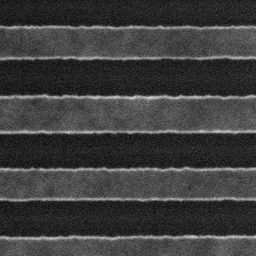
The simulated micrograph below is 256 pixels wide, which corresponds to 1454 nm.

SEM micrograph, lines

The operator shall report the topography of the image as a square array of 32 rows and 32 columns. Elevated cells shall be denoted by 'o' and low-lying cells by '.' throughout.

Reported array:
................................
................................
................................
oooooooooooooooooooooooooooooooo
oooooooooooooooooooooooooooooooo
oooooooooooooooooooooooooooooooo
oooooooooooooooooooooooooooooooo
................................
................................
................................
................................
................................
oooooooooooooooooooooooooooooooo
oooooooooooooooooooooooooooooooo
oooooooooooooooooooooooooooooooo
oooooooooooooooooooooooooooooooo
oooooooooooooooooooooooooooooooo
................................
................................
................................
................................
oooooooooooooooooooooooooooooooo
oooooooooooooooooooooooooooooooo
oooooooooooooooooooooooooooooooo
oooooooooooooooooooooooooooooooo
................................
................................
................................
................................
................................
oooooooooooooooooooooooooooooooo
oooooooooooooooooooooooooooooooo